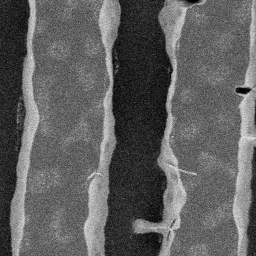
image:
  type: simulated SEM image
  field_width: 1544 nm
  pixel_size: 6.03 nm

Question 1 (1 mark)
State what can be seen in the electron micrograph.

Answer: one or a few lines or trenches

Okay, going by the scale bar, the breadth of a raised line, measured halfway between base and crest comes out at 493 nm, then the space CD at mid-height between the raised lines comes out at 370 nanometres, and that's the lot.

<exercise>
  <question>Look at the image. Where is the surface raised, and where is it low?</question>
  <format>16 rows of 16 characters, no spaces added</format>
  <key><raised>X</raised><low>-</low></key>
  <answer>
--XXXXX----XXXXX
--XXXXX----XXXXX
--XXXXX----XXXXX
--XXXXX----XXXXX
--XXXXX----XXXXX
--XXXXX----XXXXX
--XXXXX---XXXXXX
--XXXXX---XXXXXX
--XXXXX---XXXXXX
--XXXXX---XXXXX-
-XXXXX----XXXXX-
-XXXXX-----XXXX-
-XXXXX-----XXXX-
-XXXXX-----XXXX-
-XXXXX----XXXXX-
-XXXXX----XXXXX-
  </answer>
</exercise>